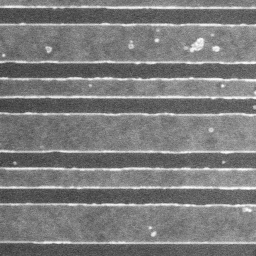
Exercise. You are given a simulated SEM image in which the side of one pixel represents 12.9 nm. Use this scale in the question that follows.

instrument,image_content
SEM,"lines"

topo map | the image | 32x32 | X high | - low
XXXXXXXXXXXXXXXXXXXXXXXXXXXXXXXX
--------------------------------
--------------------------------
XXXXXXXXXXXXXXXXXXXXXXXXXXXXXXXX
XXXXXXXXXXXXXXXXXXXXXXXXXXXXXXXX
XXXXXXXXXXXXXXXXXXXXXXXXXXXXXXXX
XXXXXXXXXXXXXXXXXXXXXXXXXXXXXXXX
XXXXXXXXXXXXXXXXXXXXXXXXXXXXXXXX
--------------------------------
--------------------------------
XXXXXXXXXXXXXXXXXXXXXXXXXXXXXXXX
XXXXXXXXXXXXXXXXXXXXXXXXXXXXXXXX
--------------------------------
--------------------------------
XXXXXXXXXXXXXXXXXXXXXXXXXXXXXXXX
XXXXXXXXXXXXXXXXXXXXXXXXXXXXXXXX
XXXXXXXXXXXXXXXXXXXXXXXXXXXXXXXX
XXXXXXXXXXXXXXXXXXXXXXXXXXXXXXXX
XXXXXXXXXXXXXXXXXXXXXXXXXXXXXXXX
--------------------------------
--------------------------------
XXXXXXXXXXXXXXXXXXXXXXXXXXXXXXXX
XXXXXXXXXXXXXXXXXXXXXXXXXXXXXXXX
---------X------XX---------XXXXX
--------------------------------
---X----------------------------
XXXXXXXXXXXXXXXXXXXXXXXXXXXXXXXX
XXXXXXXXXXXXXXXXXXXXXXXXXXXXXXXX
XXXXXXXXXXXXXXXXXXXXXXXXXXXXXXXX
XXXXXXXXXXXXXXXXXXXXXXXXXXXXXXXX
--------------------------------
--------------------------------